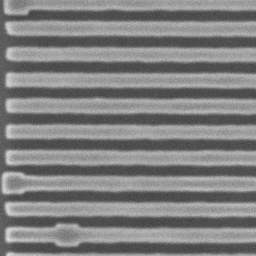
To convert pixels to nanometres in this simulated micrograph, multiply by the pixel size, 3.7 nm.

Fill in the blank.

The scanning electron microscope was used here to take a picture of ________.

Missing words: wiring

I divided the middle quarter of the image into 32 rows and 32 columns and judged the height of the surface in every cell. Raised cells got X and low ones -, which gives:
--------------------------------
--------------------------------
--XX----------------------------
XXXXXXXXXXXXXXXXXXXXXXXXXXXXXXXX
XXXXXXXXXXXXXXXXXXXXXXXXXXXXXXXX
XXXXXXXXXXXXXXXXXXXXXXXXXXXXXXXX
--------------------------------
--------------------------------
--------------------------------
XXXXXXXXXXXXXXXXXXXXXXXXXXXXXXXX
XXXXXXXXXXXXXXXXXXXXXXXXXXXXXXXX
XXXXXXXXXXXXXXXXXXXXXXXXXXXXXXXX
--------------------------------
--------------------------------
--------------------------------
XXXXXXXXXXXXXXXXXXXXXX-XXXXXXXXX
XXXXXXXXXXXXXXXXXXXXXXXXXXXXXXXX
XXXXXXXXXXXXXXXXXXXXXXXXXXXXXXXX
------XXXXXXXXXXXXXX-XXXXXX--XXX
--------------------------------
--------------------------------
--------------------------------
XXXXXXXXXXXXXXXXXXXXXXXXXXXXXXXX
XXXXXXXXXXXXXXXXXXXXXXXXXXXXXXXX
XXXXXXXXXXXXXXXXXXXXXXXXXXXXXXXX
--------------------------------
--------------------------------
--------------------------------
XXXXXXXXXXXXXXXXXXXXXXXXXXXXXXXX
XXXXXXXXXXXXXXXXXXXXXXXXXXXXXXXX
XXXXXXXXXXXXXXXXXXXXXXXXXXXXXXXX
X------XXXXXXXXXXXXXXXXXXXXXXXXX